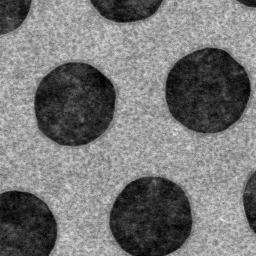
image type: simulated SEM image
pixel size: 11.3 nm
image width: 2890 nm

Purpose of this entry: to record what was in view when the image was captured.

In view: holes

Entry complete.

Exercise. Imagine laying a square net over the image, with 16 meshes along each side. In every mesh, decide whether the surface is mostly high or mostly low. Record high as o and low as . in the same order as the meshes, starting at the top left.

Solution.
..oooo....oooooo
.ooooooooooooooo
oooooooooooooooo
oooooooooooo..oo
ooo...ooooo....o
oo.....ooo......
oo.....ooo.....o
oo.....oooo....o
ooo...oooooooooo
oooooooooooooooo
oooooooooooooooo
oooooooo...oooo.
...oooo.....ooo.
...oooo.....ooo.
....ooo.....oooo
...ooooo...ooooo